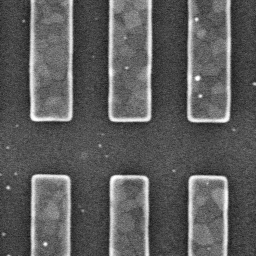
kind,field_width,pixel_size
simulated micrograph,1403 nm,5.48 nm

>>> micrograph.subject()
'wiring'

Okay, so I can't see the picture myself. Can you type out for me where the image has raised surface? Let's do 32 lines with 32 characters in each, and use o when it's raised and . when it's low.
....ooooo.....ooooo.....ooooo...
....ooooo.....ooooo.....ooooo...
....ooooo.....ooooo.....ooooo...
....ooooo.....ooooo.....ooooo...
....ooooo.....ooooo.....ooooo...
....ooooo.....ooooo.....ooooo...
....ooooo.....ooooo.....ooooo...
....ooooo.....ooooo.....ooooo...
....ooooo.....ooooo.....ooooo...
....ooooo.....ooooo.....ooooo...
....ooooo.....ooooo.....ooooo...
....ooooo.....ooooo.....ooooo...
....ooooo.....ooooo.....ooooo...
....ooooo.....ooooo.....ooooo...
....ooooo.....ooooo.....ooooo...
................................
................................
................................
................................
................................
................................
................................
....oooo......oooo......oooo....
....ooooo.....oooo......oooo....
....ooooo.....oooo......oooo....
....ooooo.....oooo......oooo....
....ooooo.....oooo......oooo....
....ooooo.....oooo......oooo....
....ooooo.....oooo......oooo....
....ooooo.....oooo......oooo....
....ooooo.....oooo......oooo....
....ooooo.....oooo......oooo....